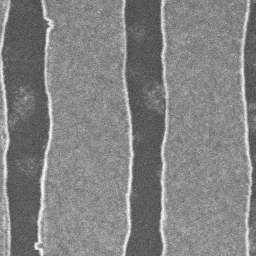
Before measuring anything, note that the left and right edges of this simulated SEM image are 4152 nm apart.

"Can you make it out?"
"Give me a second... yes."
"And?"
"one or a few lines or trenches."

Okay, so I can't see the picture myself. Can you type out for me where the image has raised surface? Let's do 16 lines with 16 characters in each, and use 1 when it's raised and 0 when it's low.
1001111100111111
0001111100111110
0001111100111110
0001111100111110
0001111100111110
0001111100111110
0001111100111110
0001111100111110
0001111100111110
0001111100111110
0001111100111111
0001111100111111
0001111100111111
1001111100111110
1011111100111110
1011111100111110